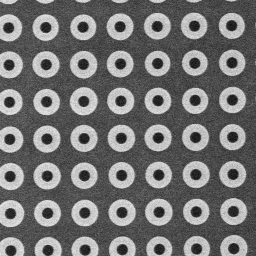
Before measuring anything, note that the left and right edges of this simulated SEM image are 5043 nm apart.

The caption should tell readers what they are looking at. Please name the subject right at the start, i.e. an array of small figures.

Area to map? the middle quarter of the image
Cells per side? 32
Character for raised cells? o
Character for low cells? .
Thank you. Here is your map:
..oooooo...oooooo...oooooo....oo
..oooooo...oooooo....ooooo....oo
..ooooo.....oooo......ooo......o
....o...........................
................................
................................
...oooo.....oooo......ooo......o
..oooooo...oooooo....ooooo....oo
..oooooo...oooooo...ooooooo...oo
..oooooo...oooooo...ooooooo...oo
..oooooo...oooooo...oooooo....oo
..oooooo....ooooo....ooooo.....o
....oo........o.................
................................
................................
....oo.......ooo......ooo......o
..oooooo....ooooo....ooooo....oo
..oooooo...ooooooo..ooooooo...oo
..oooooo...ooooooo..ooooooo...oo
..oooooo...ooooooo..ooooooo...oo
..oooooo....ooooo....ooooo....oo
...ooo.......ooo......ooo.......
................................
................................
................................
...oooo.....ooooo....ooooo....oo
..oooooo...oooooo....oooooo...oo
..oooooo...ooooooo..ooooooo...oo
..oooooo...ooooooo..ooooooo...oo
..oooooo....ooooo....ooooo....oo
...oooo......ooo......ooo......o
................................